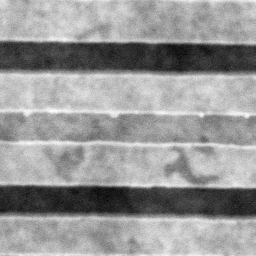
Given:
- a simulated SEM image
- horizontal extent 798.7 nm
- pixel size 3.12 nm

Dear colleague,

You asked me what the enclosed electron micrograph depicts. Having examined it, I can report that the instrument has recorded lines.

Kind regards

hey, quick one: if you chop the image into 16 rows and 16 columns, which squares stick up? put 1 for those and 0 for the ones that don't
1111111111111111
1111111111111111
1111111111111111
0000000000000000
0000000000000000
1111111111111111
1111111111111111
1111111111111111
1111111111111111
1111111111111111
1111111111111111
1111111111111111
0000000000000000
0000000000000000
1111111111111111
1111111111111111